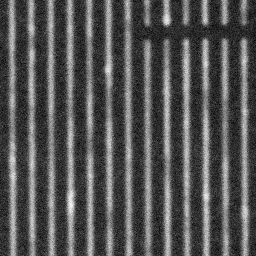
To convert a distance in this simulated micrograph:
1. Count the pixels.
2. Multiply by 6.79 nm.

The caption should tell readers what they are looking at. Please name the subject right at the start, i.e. parallel lines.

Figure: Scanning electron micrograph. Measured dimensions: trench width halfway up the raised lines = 105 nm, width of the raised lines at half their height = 26.3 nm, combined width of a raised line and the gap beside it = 131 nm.